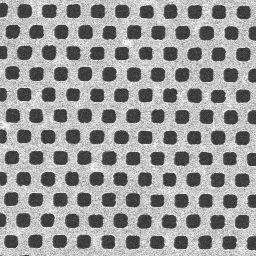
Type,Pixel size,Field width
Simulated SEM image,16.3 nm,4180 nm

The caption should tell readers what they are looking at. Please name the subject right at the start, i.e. a regular array of holes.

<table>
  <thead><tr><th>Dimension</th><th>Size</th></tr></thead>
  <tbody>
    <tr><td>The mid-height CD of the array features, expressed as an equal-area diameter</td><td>247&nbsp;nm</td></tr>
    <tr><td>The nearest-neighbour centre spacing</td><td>390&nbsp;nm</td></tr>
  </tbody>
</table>